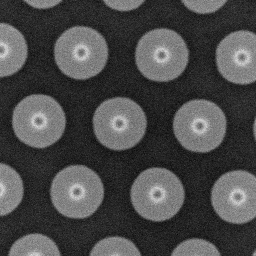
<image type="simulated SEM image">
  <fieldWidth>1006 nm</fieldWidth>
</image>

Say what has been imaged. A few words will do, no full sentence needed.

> an array of small figures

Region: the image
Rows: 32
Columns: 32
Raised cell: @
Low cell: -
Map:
----@@@------@@@@@-----@@@@@----
------------------------@@@-----
--------------------------------
@@-------@@---------------------
@@@-----@@@@@-----@@@@------@@@@
@@@----@@@@@@----@@@@@@----@@@@@
@@@----@@@@@@----@@@@@@@---@@@@@
@@@----@@@@@@----@@@@@@@---@@@@@
@@@----@@@@@@----@@@@@@----@@@@@
@--------@@@------@@@@------@@@@
------------------------------@-
--------------------------------
---@@@@------@@@--------@@------
--@@@@@@----@@@@@@-----@@@@-----
--@@@@@@----@@@@@@----@@@@@@----
--@@@@@@----@@@@@@----@@@@@@----
--@@@@@@----@@@@@@----@@@@@@----
---@@@@-----@@@@@@----@@@@@@----
--------------@@-------@@@@-----
--------------------------------
--------------------------------
@@-----@@@@@------@@@--------@@-
@@@----@@@@@@----@@@@@-----@@@@@
@@@---@@@@@@@---@@@@@@@----@@@@@
@@@---@@@@@@@---@@@@@@@---@@@@@@
@@-----@@@@@@----@@@@@@----@@@@@
@------@@@@@-----@@@@@-----@@@@@
-------------------@@-------@@@-
--------------------------------
---@@@--------------------------
--@@@@@-----@@@@@------@@@------
-@@@@@@----@@@@@@-----@@@@@-----